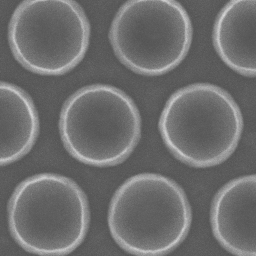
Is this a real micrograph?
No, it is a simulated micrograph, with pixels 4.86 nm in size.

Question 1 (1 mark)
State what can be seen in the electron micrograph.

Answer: raised bodies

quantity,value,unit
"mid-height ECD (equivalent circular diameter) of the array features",78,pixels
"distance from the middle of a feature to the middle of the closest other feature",490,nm